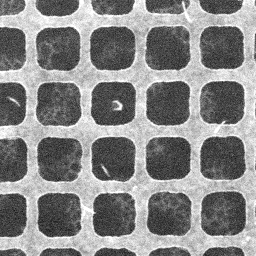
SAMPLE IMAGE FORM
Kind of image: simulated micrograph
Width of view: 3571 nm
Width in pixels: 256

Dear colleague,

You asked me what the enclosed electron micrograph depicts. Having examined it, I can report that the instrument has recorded a regular array of holes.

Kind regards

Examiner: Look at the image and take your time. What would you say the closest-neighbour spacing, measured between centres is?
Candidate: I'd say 0.759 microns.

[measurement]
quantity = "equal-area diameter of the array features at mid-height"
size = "48.2 px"